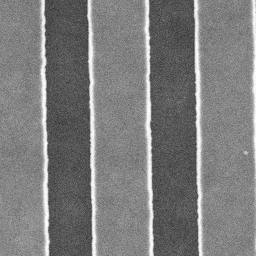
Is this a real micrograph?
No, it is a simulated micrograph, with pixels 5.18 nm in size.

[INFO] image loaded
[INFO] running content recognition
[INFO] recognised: lines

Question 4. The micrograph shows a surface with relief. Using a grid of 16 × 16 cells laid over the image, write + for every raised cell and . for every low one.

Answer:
+++...+++...++++
+++...+++...++++
+++...+++...++++
+++...+++...++++
+++...+++...++++
+++...+++...++++
+++...+++...++++
+++...+++...++++
+++...+++...++++
+++...+++...++++
+++...+++...++++
+++...+++...++++
+++...++++..++++
+++...++++..++++
+++...++++..++++
+++...++++..++++